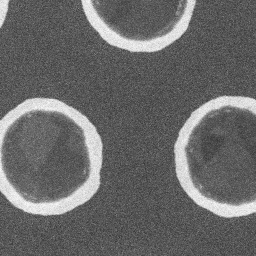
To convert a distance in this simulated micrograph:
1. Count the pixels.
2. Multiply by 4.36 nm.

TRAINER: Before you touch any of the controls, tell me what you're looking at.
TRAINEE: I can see raised bodies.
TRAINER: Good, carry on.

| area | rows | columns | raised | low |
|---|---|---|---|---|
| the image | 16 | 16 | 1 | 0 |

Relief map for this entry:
0000001111110000
0000001111100000
0000000111000000
0000000000000000
0000000000000000
0000000000000000
0000000000000011
0111100000001111
1111110000011111
1111110000011111
1111110000011111
1111110000001111
0111100000000111
0000000000000000
0000000000000000
0000000000000000